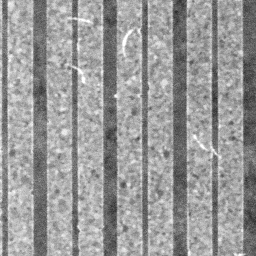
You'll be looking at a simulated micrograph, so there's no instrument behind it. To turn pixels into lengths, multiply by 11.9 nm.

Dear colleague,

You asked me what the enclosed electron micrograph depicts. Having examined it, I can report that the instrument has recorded parallel lines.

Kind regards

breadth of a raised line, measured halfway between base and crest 287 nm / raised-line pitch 418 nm